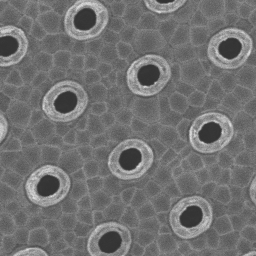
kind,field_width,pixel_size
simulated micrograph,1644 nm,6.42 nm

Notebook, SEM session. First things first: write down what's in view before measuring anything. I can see ring-shaped raised bodies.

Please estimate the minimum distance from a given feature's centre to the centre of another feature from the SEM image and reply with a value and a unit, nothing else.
85.2 pixels